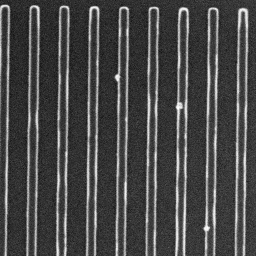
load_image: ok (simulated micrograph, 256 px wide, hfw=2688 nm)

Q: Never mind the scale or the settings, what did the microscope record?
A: groups of lines, slits or small figures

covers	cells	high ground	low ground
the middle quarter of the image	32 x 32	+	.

+.....++......++.....++......++.
+.....++......++.....++......++.
+.....++.....+++.....++......++.
+.....++.....+++.....++......++.
+.....++.....+++.....++......++.
+.....++......++.....++......++.
+.....++......++.....++......++.
+.....++......++.....++......++.
+.....++......++.....++.....+++.
+.....++......++.....++.....++..
+.....++......++.....++.....++..
+.....++......++.....++.....++..
+.....++......++.....++......+..
+.....++......++.....++.....++..
+.....++......++.....++.....++..
+.....++......++.....++.....++..
+.....++......++.....++.....++..
+.....++......++.....++.....++..
+.....++.....+++.....++.....++..
+.....++.....+++.....++.....++..
+.....++.....+++.....++.....++..
+.....++.....++......++.....++..
+.....++.....++......++.....++..
+.....++.....++......++.....++..
+.....++.....++......++.....++..
+.....++.....++......++.....++..
......++.....++......++.....++..
......++.....++......++.....++..
......++.....++......++.....++..
......++.....++......++.....++..
+.....++.....++......++.....++..
+.....++.....++......++.....++..